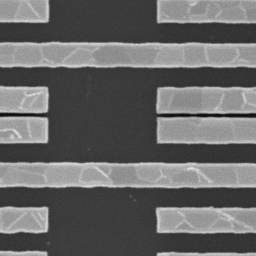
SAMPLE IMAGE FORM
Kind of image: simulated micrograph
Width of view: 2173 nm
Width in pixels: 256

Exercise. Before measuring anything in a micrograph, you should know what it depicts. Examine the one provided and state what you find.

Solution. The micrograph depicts wiring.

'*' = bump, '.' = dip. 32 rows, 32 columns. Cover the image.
******..............************
******..............************
******..............************
................................
................................
***************************.****
********************************
********************************
................................
................................
................................
******..............************
******..............************
******..............************
*****...............***********.
******..............************
******..............************
******..............************
................................
................................
***************.****************
********************************
********************************
................................
................................
................................
******..............************
******..............************
******..............************
................................
................................
................................